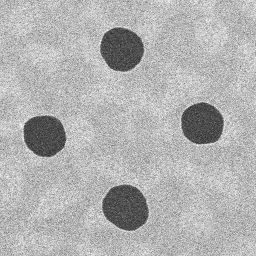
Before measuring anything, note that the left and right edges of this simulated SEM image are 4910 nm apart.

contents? holes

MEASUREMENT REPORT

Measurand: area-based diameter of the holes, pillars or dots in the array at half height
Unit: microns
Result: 0.835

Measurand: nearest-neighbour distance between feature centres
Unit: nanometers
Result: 2090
